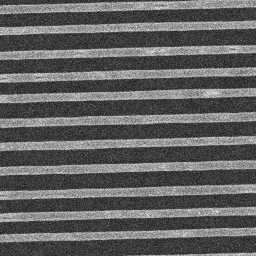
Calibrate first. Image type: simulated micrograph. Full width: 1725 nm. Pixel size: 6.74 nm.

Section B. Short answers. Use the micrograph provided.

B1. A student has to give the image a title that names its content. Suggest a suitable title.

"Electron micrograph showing parallel lines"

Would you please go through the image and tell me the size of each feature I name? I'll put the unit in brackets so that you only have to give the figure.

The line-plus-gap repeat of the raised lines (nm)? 154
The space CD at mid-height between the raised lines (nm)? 101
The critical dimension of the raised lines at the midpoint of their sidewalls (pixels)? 8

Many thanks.